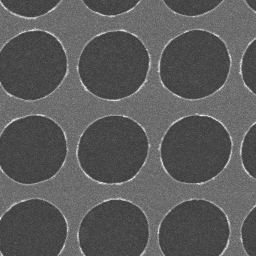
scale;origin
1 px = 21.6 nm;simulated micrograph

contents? holes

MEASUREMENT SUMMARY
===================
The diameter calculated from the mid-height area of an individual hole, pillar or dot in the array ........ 1510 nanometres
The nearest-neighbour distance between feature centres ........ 1780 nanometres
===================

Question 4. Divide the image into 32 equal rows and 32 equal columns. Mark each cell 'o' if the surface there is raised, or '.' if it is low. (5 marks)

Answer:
.......oooo......oooo......oooo.
o.....oooooo....oooooo....oooooo
oooooooooooooooooooooooooooooooo
oooooooooooooooooooooooooooooooo
oo.....ooooo.....ooooo.....ooooo
o.......ooo.......ooo.......ooo.
........oo........oo.........oo.
........oo.........o.........o..
........oo.........o.........o..
........oo........oo........oo..
.......ooo........oo........ooo.
o......oooo......oooo......ooooo
ooo..ooooooooooooooooooooooooooo
oooooooooooooooooooooooooooooooo
ooo..ooooooooo.ooooooooo..oooooo
o......oooo......ooooo......oooo
........ooo.......ooo.......ooo.
........oo........oo.........o..
........oo.........o.........o..
........oo........oo.........o..
........oo........oo........oo..
.......oooo......oooo.......ooo.
oo....oooooo....oooooo....oooooo
oooooooooooooooooooooooooooooooo
oooooooooooooooooooooooooooooooo
oo....ooooooo....ooooo.....ooooo
o.......ooo.......ooo.......ooo.
........oo........oo........ooo.
........oo.........o.........o..
........oo.........o.........o..
........oo........oo........oo..
.......ooo........oo........ooo.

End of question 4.